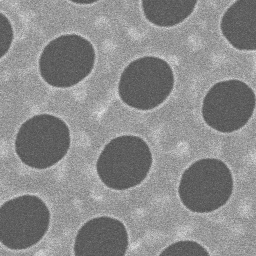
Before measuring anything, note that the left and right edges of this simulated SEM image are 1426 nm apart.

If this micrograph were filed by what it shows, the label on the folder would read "holes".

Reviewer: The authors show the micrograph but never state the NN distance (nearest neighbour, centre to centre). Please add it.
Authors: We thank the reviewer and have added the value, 459 nm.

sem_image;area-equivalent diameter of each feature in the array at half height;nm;306